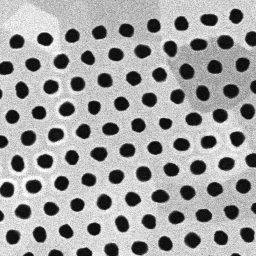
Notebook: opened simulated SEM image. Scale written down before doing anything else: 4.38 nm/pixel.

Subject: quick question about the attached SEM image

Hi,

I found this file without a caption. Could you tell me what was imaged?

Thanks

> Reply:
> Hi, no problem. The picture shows a regular array of holes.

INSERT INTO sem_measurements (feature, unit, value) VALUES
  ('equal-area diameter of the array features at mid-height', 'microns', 0.0613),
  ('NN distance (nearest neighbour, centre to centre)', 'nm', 118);